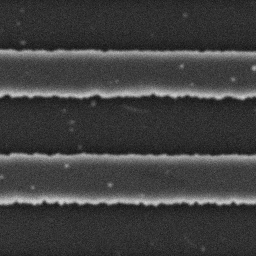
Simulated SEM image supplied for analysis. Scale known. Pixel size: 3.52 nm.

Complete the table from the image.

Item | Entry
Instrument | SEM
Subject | lines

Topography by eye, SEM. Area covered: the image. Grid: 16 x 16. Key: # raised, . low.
................
................
................
################
################
################
................
................
................
................
################
################
################
................
................
................